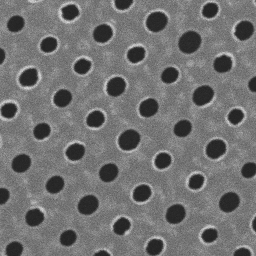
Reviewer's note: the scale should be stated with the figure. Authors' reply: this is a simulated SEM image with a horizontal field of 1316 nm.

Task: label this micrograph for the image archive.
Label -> a regular array of holes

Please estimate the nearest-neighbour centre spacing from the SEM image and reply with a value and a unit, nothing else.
0.197 µm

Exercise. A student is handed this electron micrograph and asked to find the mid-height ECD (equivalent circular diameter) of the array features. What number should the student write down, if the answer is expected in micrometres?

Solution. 0.0929